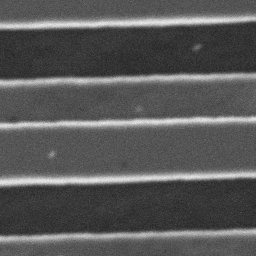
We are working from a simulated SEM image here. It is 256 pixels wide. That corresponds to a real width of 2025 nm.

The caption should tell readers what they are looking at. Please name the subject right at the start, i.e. lines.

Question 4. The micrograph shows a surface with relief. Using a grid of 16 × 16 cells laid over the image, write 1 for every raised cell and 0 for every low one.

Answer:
1111111111111111
1111111100000000
0000000000000000
0000000000000000
0000000000000000
1111111111111111
1111111111111111
1111111111111111
1111111111111111
1111111111111111
1111111111111111
0000000000000000
0000000000000000
0000000000000000
0000000000000001
1111111111111111